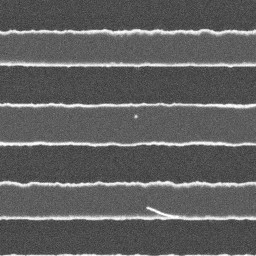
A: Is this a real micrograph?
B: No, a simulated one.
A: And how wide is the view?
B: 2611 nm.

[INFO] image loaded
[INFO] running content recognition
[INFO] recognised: lines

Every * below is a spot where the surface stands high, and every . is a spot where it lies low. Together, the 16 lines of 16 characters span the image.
................
................
****************
****************
................
................
................
****************
****************
................
................
****.***********
****************
****************
................
................